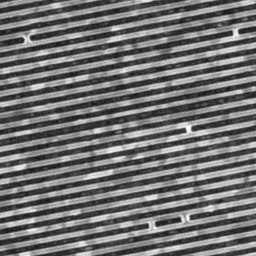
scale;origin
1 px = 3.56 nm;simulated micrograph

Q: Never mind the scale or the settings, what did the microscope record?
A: parallel lines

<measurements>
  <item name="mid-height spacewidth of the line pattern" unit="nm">24.5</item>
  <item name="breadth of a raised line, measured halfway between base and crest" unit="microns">0.0153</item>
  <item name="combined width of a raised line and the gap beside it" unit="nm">38.7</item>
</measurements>